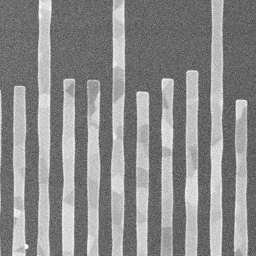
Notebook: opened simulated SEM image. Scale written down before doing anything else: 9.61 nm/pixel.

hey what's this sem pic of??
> groups of lines, slits or small figures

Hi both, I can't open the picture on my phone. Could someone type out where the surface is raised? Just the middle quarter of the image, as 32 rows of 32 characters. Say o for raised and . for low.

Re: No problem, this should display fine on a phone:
............ooo.................
............ooo.................
............ooo................o
............ooo................o
ooo...ooo...ooo..........oo....o
ooo...ooo...ooo..........oo....o
ooo...ooo...ooo..........oo....o
ooo...ooo...ooo...ooo....oo....o
oo....ooo...ooo...ooo....oo....o
oo....ooo...ooo...ooo....oo....o
ooo...ooo...ooo...ooo....oo....o
ooo...ooo...ooo...ooo....oo....o
ooo...ooo...ooo...ooo....oo....o
ooo...ooo...ooo...ooo....oo....o
oo....ooo...ooo...ooo....oo....o
oo....ooo...ooo...ooo....oo....o
oo....ooo...ooo...ooo....oo....o
oo....oo....ooo...ooo....oo....o
ooo...oo....ooo...ooo....oo....o
ooo...oo....ooo...ooo....oo....o
ooo...ooo...ooo...ooo....oo....o
ooo...ooo...ooo...ooo....oo....o
ooo...ooo...ooo...ooo....oo....o
oo....ooo...ooo...ooo....oo....o
oo....ooo...ooo...ooo....oo....o
oo....ooo...ooo...ooo....oo....o
oo....ooo...ooo...ooo....oo....o
oo....ooo...ooo...ooo....oo....o
oo....ooo...ooo...ooo....oo....o
oo....ooo...ooo...ooo....oo....o
oo....ooo...ooo...ooo....oo....o
oo....ooo...ooo...ooo....oo....o